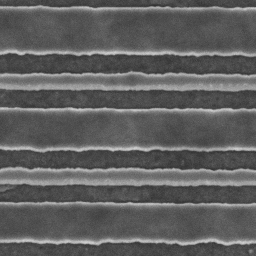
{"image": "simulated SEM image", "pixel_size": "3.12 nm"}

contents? lines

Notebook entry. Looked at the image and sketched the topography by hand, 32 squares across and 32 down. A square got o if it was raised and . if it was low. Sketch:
................................
oooooooooooooooooooooooooooooooo
oooooooooooooooooooooooooooooooo
oooooooooooooooooooooooooooooooo
oooooooooooooooooooooooooooooooo
oooooooooooooooooooooooooooooooo
o.oooooooooooooooooooooooooooooo
................................
................................
oooooooooooooooooooooooooooooooo
oooooooooooooooooooooooooooooooo
................................
................................
ooo.....o....o..................
oooooooooooooooooooooooooooooooo
oooooooooooooooooooooooooooooooo
oooooooooooooooooooooooooooooooo
oooooooooooooooooooooooooooooooo
oooooooooooooooooooooooooooooooo
................................
................................
oooooooooooooooooooooooooooooooo
oooooooooooooooooooooooooooooooo
................................
................................
oooooooooooooooooooooo.ooooo...o
oooooooooooooooooooooooooooooooo
oooooooooooooooooooooooooooooooo
oooooooooooooooooooooooooooooooo
oooooooooooooooooooooooooooooooo
...........o..........oo....o.o.
................................